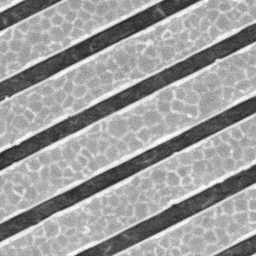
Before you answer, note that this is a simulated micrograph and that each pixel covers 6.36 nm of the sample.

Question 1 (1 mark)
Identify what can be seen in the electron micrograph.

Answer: one or a few lines or trenches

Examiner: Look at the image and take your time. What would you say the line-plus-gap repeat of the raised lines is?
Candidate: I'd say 62.7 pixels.